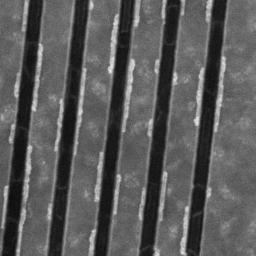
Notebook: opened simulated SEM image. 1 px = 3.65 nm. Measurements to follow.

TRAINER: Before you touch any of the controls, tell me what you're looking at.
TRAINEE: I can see parallel lines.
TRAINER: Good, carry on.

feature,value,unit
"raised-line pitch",167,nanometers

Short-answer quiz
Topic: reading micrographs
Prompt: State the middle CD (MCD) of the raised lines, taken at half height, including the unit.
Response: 0.115 µm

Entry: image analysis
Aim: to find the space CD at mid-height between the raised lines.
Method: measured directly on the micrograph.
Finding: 51.2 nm